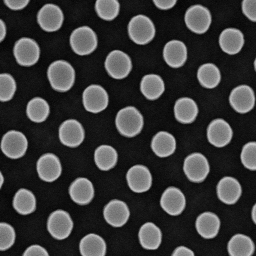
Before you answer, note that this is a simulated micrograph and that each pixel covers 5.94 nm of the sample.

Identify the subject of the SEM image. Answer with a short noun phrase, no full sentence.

a regular array of raised bodies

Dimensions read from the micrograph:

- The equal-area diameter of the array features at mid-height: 155 nanometers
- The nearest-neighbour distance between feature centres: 0.241 micrometres